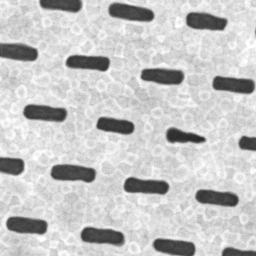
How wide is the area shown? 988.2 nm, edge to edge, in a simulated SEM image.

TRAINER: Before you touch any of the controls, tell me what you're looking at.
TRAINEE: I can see a regular array of holes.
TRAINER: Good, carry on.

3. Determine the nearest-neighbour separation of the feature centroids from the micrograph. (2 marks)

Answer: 0.253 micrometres